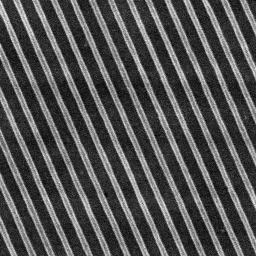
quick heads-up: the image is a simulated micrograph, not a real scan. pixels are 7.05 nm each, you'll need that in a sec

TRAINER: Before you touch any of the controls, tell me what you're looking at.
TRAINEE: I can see parallel lines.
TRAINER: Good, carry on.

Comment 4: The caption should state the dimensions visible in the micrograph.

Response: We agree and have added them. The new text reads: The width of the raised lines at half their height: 32.4 nanometres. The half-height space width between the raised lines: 90.6 nanometers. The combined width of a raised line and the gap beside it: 122 nanometres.